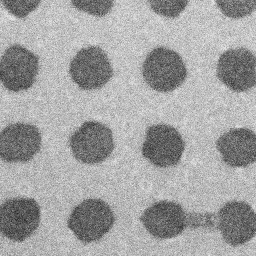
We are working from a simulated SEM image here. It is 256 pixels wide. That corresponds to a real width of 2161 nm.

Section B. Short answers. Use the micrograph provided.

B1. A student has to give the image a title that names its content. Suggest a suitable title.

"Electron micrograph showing raised bodies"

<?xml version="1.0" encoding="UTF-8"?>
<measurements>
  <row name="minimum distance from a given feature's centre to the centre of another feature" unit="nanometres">617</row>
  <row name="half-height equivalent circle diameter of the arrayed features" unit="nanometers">375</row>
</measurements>